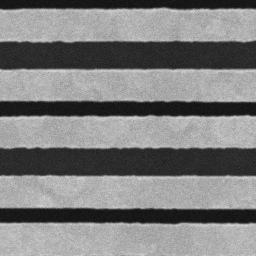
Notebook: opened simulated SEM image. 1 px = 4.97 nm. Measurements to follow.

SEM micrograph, lines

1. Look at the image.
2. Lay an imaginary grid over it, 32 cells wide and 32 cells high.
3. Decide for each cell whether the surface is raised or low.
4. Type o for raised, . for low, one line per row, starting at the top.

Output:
................................
oooooooooooooooooooooooooooooooo
oooooooooooooooooooooooooooooooo
oooooooooooooooooooooooooooooooo
oooooooooooooooooooooooooooooooo
................................
................................
................................
................................
oooooooooooooooooooooooooooooooo
oooooooooooooooooooooooooooooooo
oooooooooooooooooooooooooooooooo
oooooooooooooooooooooooooooooooo
................................
..............................o.
oooooooooooooooooooooooooooooooo
oooooooooooooooooooooooooooooooo
oooooooooooooooooooooooooooooooo
................................
................................
................................
................................
oooooooooooooooooooooooooooooooo
oooooooooooooooooooooooooooooooo
oooooooooooooooooooooooooooooooo
oooooooooooooooooooooooooooooooo
................................
................................
oooooooooooooooooooooooooooooooo
oooooooooooooooooooooooooooooooo
oooooooooooooooooooooooooooooooo
oooooooooooooooooooooooooooooooo